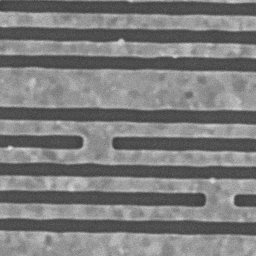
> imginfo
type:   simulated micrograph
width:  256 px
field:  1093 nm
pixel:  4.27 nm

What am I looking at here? groups of lines, slits or small figures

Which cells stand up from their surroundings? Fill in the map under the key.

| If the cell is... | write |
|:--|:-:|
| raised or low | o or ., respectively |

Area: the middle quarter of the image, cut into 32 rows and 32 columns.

................................
................................
oooooooooooooooooooooooooooooooo
oooooooooooooooooooooooooooooooo
oooooooooooooooooooooooooooooooo
oooooooooooooooooooooooooooooooo
oooooooooooooooooooooooooooooooo
oooooooooooooooooooooooooooooooo
oooooooooooooooooooooooooooooooo
oooooooooooooooooooooooooooooooo
oooooooooooooooooooooooooooooooo
................................
................................
................................
ooo..........oo.................
oooooooooooooooooooooooooooooooo
oooooooooooooooooooooooooooooooo
oooooooooooooooooooooooooooooooo
.....ooooooo....................
.....ooooooo....................
.....ooooooo....................
.oooooooooooo...................
oooooooooooooooooooooooooooooooo
oooooooooooooooooooooooooooooooo
oooooooooooooooooooooooooooooooo
................................
................................
................................
oooooo.oooooooo.................
oooooooooooooooooooooooooooooooo
oooooooooooooooooooooooooooooooo
oooooooooooooooooooooooooooooooo